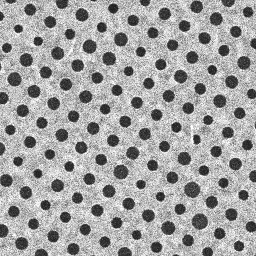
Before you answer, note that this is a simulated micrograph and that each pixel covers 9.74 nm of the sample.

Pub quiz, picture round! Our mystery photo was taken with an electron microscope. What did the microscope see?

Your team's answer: a regular array of holes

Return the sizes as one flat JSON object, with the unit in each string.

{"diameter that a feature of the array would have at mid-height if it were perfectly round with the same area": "118 nm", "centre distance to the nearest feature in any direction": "22.4 px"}